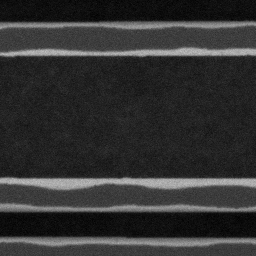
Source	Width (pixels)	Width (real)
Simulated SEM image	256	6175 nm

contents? lines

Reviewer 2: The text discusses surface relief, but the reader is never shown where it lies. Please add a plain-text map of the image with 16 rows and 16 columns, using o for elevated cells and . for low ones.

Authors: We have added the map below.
................
oooooooo.ooooooo
oooooooooooooooo
................
................
................
................
................
................
................
................
oooooooooooooooo
oooooooooooooooo
................
................
oooooooooooooooo